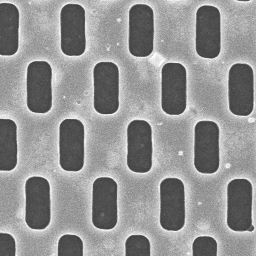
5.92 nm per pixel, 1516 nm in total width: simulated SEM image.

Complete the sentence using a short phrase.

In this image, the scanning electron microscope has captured a regular array of holes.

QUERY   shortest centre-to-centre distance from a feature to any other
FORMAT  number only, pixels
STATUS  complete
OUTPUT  66.7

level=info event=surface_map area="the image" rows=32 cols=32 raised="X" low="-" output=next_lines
-XXXXXXXXXXXXXXXX-XXXXXXXXXXXXXX
--XXXXXX---XXXXX---XXXXXX--XXXXX
--XXXXXX---XXXXX---XXXXXX---XXXX
--XXXXXX---XXXXX---XXXXX----XXXX
--XXXXXX---XXXXX---XXXXX----XXXX
--XXXXXX---XXXXX---XXXXX----XXXX
--XXXXXX--XXXXXX---XXXXXX--XXXXX
XXXXXXXXXXXXXXXXXXXXXXXXXXXXXXXX
XXX---XXXXXX---XXXXX---XXXXXX--X
XXX---XXXXXX---XXXXX---XXXXX----
XXX---XXXXXX---XXXXX---XXXXX----
XXX---XXXXXX---XXXXX---XXXXXX---
XXX----XXXXX---XXXXX---XXXXXX---
XXXX--XXXXXX---XXXXX---XXXXXX---
XXXXXXXXXXXXXXXXXXXXXXXXXXXXXXXX
--XXXXXX--XXXXXX---XXXXXX--XXXXX
--XXXXX----XXXXX---XXXXX---XXXXX
--XXXXX----XXXXX---XXXXX---XXXXX
--XXXXX----XXXXX---XXXXX---XXXXX
--XXXXX----XXXXX---XXXXX---XXXXX
--XXXXX---XXXXXX---XXXXX---XXXXX
XXXXXXXXXXXXXXXXX-XXXXXXX--XXXXX
XXX---XXXXXX--XXXXXX--XXXXXXX--X
XXX---XXXXXX---XXXXX---XXXXX---X
XXX---XXXXX----XXXXX---XXXXX----
XXX---XXXXX----XXXXX---XXXXX----
XXX---XXXXX----XXXXX---XXXXX----
XXX---XXXXXX---XXXXX---XXXXX---X
XXXX--XXXXXX--XXXXXX---XXXXXX---
-XXXXXXX--XXXXXX--XXXXXXX-XXXXXX
--XXXXX---XXXXXX---XXXXX---XXXXX
--XXXXX---XXXXXX---XXXXX---XXXXX